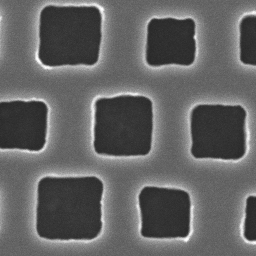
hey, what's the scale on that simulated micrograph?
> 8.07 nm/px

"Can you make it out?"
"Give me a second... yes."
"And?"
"holes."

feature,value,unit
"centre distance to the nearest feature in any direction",769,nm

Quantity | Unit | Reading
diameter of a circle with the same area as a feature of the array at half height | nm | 508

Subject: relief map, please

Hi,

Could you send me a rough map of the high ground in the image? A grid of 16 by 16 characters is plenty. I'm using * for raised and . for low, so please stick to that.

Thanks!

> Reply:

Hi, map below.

***...**********
**....***...***.
**....***...***.
**....***...***.
****************
****************
...***...*******
...***....**...*
...***...***...*
******...***...*
****************
**....**********
**....***...****
**....***...***.
**....***...***.
****************